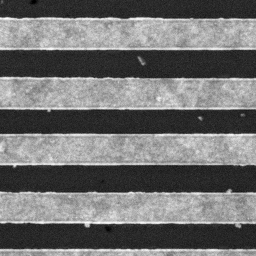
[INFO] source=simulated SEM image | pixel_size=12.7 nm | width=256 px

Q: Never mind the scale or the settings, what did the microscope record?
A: lines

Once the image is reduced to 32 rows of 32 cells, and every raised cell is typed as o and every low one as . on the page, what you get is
................................
................................
oooooooooooooooooooooooooooooooo
oooooooooooooooooooooooooooooooo
oooooooooooooooooooooooooooooooo
oooooooooooooooooooooooooooooooo
................................
................................
................................
................................
oooooooooooooooooooooooooooooooo
oooooooooooooooooooooooooooooooo
oooooooooooooooooooooooooooooooo
oooooooooooooooooooooooooooooooo
................................
................................
................................
oooooooooooooooooooooooooooooooo
oooooooooooooooooooooooooooooooo
oooooooooooooooooooooooooooooooo
oooooooooooooooooooooooooooooooo
................................
................................
................................
oooooooooooooooooooooooooooooooo
oooooooooooooooooooooooooooooooo
oooooooooooooooooooooooooooooooo
oooooooooooooooooooooooooooooooo
................................
................................
................................
oooooooooooooooooooooooooooooooo